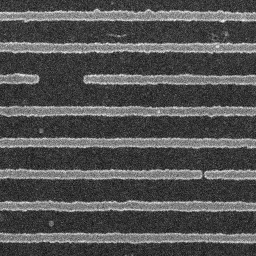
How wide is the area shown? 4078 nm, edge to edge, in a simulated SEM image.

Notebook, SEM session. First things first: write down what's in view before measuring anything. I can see parallel lines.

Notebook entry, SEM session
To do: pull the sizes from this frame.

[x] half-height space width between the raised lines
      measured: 0.366 microns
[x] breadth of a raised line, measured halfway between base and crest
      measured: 0.139 um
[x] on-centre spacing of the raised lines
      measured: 31.7 px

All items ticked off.